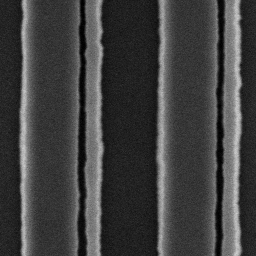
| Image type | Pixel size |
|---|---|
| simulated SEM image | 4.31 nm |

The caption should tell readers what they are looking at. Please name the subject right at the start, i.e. lines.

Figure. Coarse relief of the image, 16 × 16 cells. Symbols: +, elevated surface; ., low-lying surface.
..++++....+++++.
.+++++....+++++.
.+++++....+++++.
.+++++....+++++.
.+++++....+++++.
.+++++....+++++.
.+++++....+++++.
.+++++....+++++.
.+++++....+++++.
.+++++....+++++.
.+++++....+++++.
.+++++....+++++.
.+++++....+++++.
.+++++....+++++.
.+++++....+++++.
.+++++....+++++.